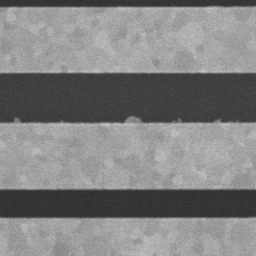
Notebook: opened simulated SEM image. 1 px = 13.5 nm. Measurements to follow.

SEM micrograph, lines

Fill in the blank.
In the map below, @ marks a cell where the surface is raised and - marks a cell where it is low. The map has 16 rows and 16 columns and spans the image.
@@@@@@@@@@@@@@@@
@@@@@@@@@@@@@@@@
@@@@@@@@@@@@@@@@
@@@@@@@@@@@@@@@@
@@@@@@@@@@@@@@@@
----------------
----------------
----------------
@@@@@@@@@@@@@@@@
@@@@@@@@@@@@@@@@
@@@@@@@@@@@@@@@@
@@@@@@@@@@@@@@@@
----------------
----------------
@@@@@@@@@@@@@@@@
@@@@@@@@@@@@@@@@